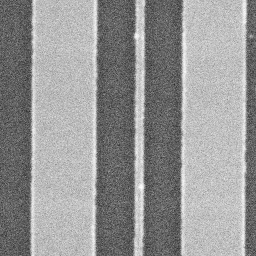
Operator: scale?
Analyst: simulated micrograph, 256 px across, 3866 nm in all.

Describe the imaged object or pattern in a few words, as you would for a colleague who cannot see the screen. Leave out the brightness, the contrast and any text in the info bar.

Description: lines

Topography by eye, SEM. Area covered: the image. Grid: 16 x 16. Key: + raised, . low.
..++++.....++++.
..++++.....++++.
..++++..+..++++.
..++++.....++++.
..++++..+..++++.
..++++.....++++.
..++++.....++++.
..++++.....++++.
..++++.....++++.
..++++.....++++.
..++++.....++++.
..++++..+..++++.
..++++.....++++.
..++++.....++++.
..++++.....++++.
..++++.....++++.